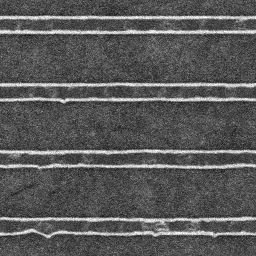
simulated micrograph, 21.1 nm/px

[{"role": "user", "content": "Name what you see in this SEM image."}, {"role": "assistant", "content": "one or a few lines or trenches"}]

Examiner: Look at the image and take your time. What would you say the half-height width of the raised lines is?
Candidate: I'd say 306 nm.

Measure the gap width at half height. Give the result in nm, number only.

1110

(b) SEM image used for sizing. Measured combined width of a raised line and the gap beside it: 1.42 um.